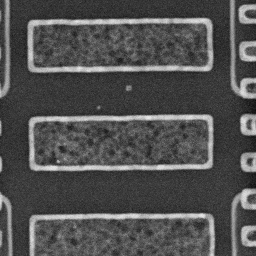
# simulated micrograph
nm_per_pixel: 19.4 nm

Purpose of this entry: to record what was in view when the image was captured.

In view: wiring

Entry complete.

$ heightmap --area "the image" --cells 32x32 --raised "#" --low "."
#............................###
#............................###
#............................###
#...######################...###
#...######################...###
#...######################...###
#...######################...###
#...######################...###
#...#############.......##...###
#............................###
#............................###
..............................##
................................
................................
................................
....######################....##
....######################.....#
....######################......
....######################......
....######################.....#
....######################....##
................................
................................
................................
..............................##
#............................###
#............................###
#...######################...###
#...######################...###
#...######################...###
#...######################...###
#...######################...###